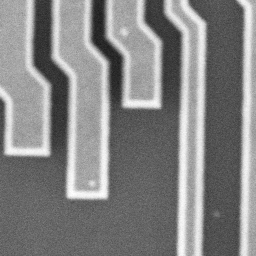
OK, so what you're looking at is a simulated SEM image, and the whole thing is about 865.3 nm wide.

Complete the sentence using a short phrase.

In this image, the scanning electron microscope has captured groups of lines, slits or small figures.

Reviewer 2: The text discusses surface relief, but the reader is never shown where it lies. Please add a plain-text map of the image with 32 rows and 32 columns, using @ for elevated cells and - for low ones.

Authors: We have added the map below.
@@@@---@@@@--@@@@@---@@-------@@
@@@@---@@@@--@@@@@---@@@-------@
@@@@---@@@@--@@@@@----@@@------@
@@@@---@@@@--@@@@@-----@@------@
@@@@---@@@@--@@@@@@----@@------@
@@@@---@@@@---@@@@@@---@@------@
@@@@---@@@@@---@@@@@---@@------@
@@@@---@@@@@@---@@@@---@@------@
@@@@----@@@@@---@@@@---@@------@
@@@@@----@@@@---@@@@---@@------@
@@@@@@---@@@@---@@@@---@@------@
@@@@@@---@@@@---@@@@---@@------@
-@@@@@---@@@@---@@@@---@@------@
-@@@@@---@@@@----------@@------@
-@@@@@---@@@@----------@@------@
-@@@@@---@@@@----------@@------@
-@@@@@---@@@@----------@@------@
-@@@@@---@@@@----------@@------@
-@@@@@---@@@@----------@@------@
---------@@@@----------@@------@
---------@@@@----------@@------@
---------@@@@----------@@------@
---------@@@@----------@@------@
---------@@@@----------@@------@
-----------------------@@------@
-----------------------@@------@
-----------------------@@-----@@
-----------------------@@-----@@
-----------------------@@-----@@
-----------------------@@-----@@
-----------------------@@-----@@
-----------------------@@-----@@